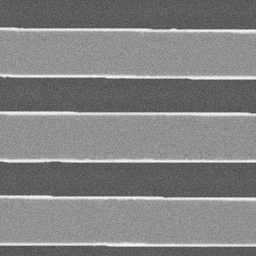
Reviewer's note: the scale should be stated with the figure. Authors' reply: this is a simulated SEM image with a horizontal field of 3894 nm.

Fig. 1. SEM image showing lines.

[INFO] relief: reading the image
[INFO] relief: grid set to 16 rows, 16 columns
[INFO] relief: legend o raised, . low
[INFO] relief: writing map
................
................
oooooooooooooooo
oooooooooooooooo
oooooooooooooooo
................
................
oooooooooooooooo
oooooooooooooooo
oooooooooooooooo
................
................
oooooooooooooooo
oooooooooooooooo
oooooooooooooooo
................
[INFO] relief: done